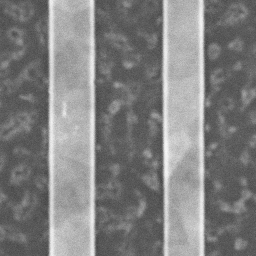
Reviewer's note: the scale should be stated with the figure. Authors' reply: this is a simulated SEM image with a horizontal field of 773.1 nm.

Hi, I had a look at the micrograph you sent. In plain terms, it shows one or a few lines or trenches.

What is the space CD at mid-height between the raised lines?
221 nanometers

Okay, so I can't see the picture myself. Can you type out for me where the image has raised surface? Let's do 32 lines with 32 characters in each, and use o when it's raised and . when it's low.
......ooooo..........oooo.......
......ooooo..........oooo.......
......ooooo..........oooo.......
......ooooo..........oooo.......
......ooooo..........oooo.......
......ooooo..........oooo.......
......ooooo..........oooo.......
......ooooo..........oooo.......
......ooooo..........oooo.......
......ooooo..........oooo.......
......ooooo..........oooo.......
......oooooo.........oooo.......
......oooooo.........oooo.......
......oooooo.........oooo.......
......oooooo.........oooo.......
......oooooo.........oooo.......
......ooooo..........oooo.......
......oooooo.........oooo.......
......oooooo.........oooo.......
......oooooo.........oooo.......
......oooooo.........oooo.......
......oooooo.........oooo.......
......oooooo.........oooo.......
......oooooo.........oooo.......
......oooooo.........oooo.......
......oooooo.........oooo.......
......oooooo.........oooo.......
......oooooo.........oooo.......
......oooooo.........oooo.......
......oooooo.........oooo.......
......oooooo.........oooo.......
......oooooo.........oooo.......